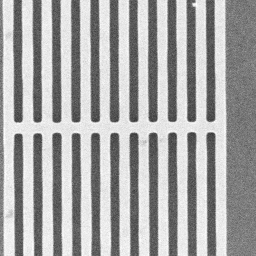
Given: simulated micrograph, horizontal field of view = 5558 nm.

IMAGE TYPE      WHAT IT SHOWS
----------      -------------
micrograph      groups of lines, slits or small figures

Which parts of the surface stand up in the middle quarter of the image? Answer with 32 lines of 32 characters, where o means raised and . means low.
oo..ooo..oo...oo...oo...oo..ooo.
oo..oo...oo...oo...oo...oo..ooo.
oo..oo...oo...oo...oo...oo..ooo.
oo..ooo..oo...oo...oo...oo..ooo.
oo..ooo..oo...oo...oo...oo..ooo.
oo..ooo..oo...oo...oo...oo..ooo.
oo..ooo..oo...oo...oo...oo..ooo.
oo..ooo..oo...oo...oo...oo..ooo.
oo..ooo..oo...oo...oo...oo..ooo.
oo..ooo..oo...oo...oo...oo..ooo.
oo..ooo..oo...oo...oo...oo..ooo.
oo..ooo..oo...oo...oo...oo..ooo.
oo..ooo..oo...oo...oo...oo..ooo.
oo..ooo..oo...oo...oo...oo..ooo.
oo..ooo..ooo.oooo.oooo.oooo.ooo.
oooooooooooooooooooooooooooooooo
oooooooooooooooooooooooooooooooo
oo..ooo..ooo..oo...oo..ooo..ooo.
oo..ooo..oo...oo...oo...oo..ooo.
oo..ooo..oo...oo...oo...oo..ooo.
oo..ooo..oo...oo...oo...oo..ooo.
oo..ooo..oo...oo...oo...oo..ooo.
oo..ooo..oo...oo...oo...oo..ooo.
oo..ooo..oo...oo...oo...oo..ooo.
oo..ooo..oo...oo...oo...oo..ooo.
oo..ooo..oo...oo...oo...oo..ooo.
oo..ooo..oo...oo...oo...oo..ooo.
oo..ooo..oo...oo...oo...oo..ooo.
oo..ooo..oo...oo...oo...oo...oo.
oo..ooo..oo...oo...oo...oo...oo.
oo..ooo..oo...oo...oo...oo...oo.
oo..ooo..oo...oo...oo...oo...oo.